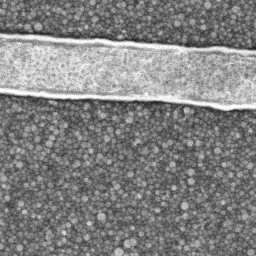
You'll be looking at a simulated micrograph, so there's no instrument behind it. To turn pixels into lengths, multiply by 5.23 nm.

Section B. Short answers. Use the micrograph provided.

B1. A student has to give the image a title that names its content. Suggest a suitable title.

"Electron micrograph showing one or a few lines or trenches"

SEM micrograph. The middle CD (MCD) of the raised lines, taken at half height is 285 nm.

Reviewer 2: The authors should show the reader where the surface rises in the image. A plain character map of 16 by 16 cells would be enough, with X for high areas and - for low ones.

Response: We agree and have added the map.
----------------
----------------
XXXX------------
XXXXXXXXXXXXXXXX
XXXXXXXXXXXXXXXX
XXXXXXXXXXXXXXXX
-------------XXX
----------------
----------------
----------------
----------------
----------------
----------------
----------------
----------------
----------------